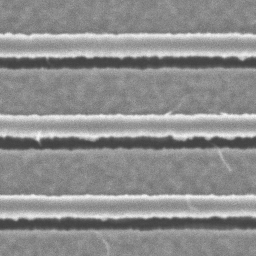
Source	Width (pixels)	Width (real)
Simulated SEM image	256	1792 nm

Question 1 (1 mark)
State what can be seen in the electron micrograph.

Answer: lines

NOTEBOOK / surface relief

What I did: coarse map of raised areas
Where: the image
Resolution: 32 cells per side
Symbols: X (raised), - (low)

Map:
XXXXXXXXXXXXXXXXXXXXXXXXXXXXXXXX
XXXXXXXXXXXXXXXXXXXXXXXXXXXXXXXX
XXXXXXXXXXXXXXXXXXXXXXXXXXXXXXXX
XXXXXXXXXXXXXXXXXXXXXXXXXXXXXXXX
XXXXXXXXXXXXXXXXXXXXXXXXXXXXXXXX
XXXXXXXXXXXXXXXXXXXXXXXXXXXXXXXX
XXXXXXXXXXXXXXXXXXXXXXXXXXXXXXXX
--------------------------------
--------------------------------
XXXXXXXXXXXXXXXXXXXXXXXXXXXXXXXX
XXXXXXXXXXXXXXXXXXXXXXXXXXXXXXXX
XXXXXXXXXXXXXXXXXXXXXXXXXXXXXXXX
XXXXXXXXXXXXXXXXXXXXXXXXXXXXXXXX
XXXXXXXXXXXXXXXXXXXXXXXXXXXXXXXX
XXXXXXXXXXXXXXXXXXXXXXXXXXXXXXXX
XXXXXXXXXXXXXXXXXXXXXXXXXXXXXXXX
XXXXXXXXXXXXXXXXXXXXXXXXXXXXXXXX
----X------X--------------------
--------------------------------
XXXXXXXXXXXXXXXXXXXXXXXXXXXXXXXX
XXXXXXXXXXXXXXXXXXXXXXXXXXXXXXXX
XXXXXXXXXXXXXXXXXXXXXXXXXXXXXXXX
XXXXXXXXXXXXXXXXXXXXXXXXXXXXXXXX
XXXXXXXXXXXXXXXXXXXXXXXXXXXXXXXX
XXXXXXXXXXXXXXXXXXXXXXXXXXXXXXXX
XXXXXXXXXXXXXXXXXXXXXXXXXXXXXXXX
XXXXXXXXXXXXXXXXXXXXXXXXXXXXXXXX
--------------------------------
--------------------------------
XXXXXXXXXXXXXXXXXXXXXXXXXXXXXXXX
XXXXXXXXXXXXXXXXXXXXXXXXXXXXXXXX
XXXXXXXXXXXXXXXXXXXXXXXXXXXXXXXX